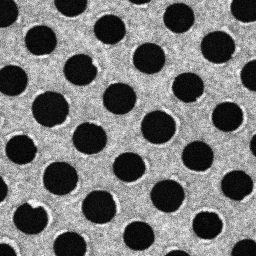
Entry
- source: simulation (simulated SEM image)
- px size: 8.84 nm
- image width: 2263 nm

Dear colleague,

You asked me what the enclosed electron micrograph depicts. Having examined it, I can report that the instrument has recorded a regular array of holes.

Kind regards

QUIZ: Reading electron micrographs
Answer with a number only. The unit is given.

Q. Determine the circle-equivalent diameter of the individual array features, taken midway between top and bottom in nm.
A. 282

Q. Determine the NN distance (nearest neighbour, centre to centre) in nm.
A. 431